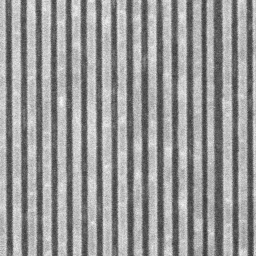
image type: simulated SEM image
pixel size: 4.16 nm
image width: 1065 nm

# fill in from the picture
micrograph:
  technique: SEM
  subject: parallel lines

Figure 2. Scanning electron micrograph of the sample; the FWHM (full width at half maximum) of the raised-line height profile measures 33.3 nanometres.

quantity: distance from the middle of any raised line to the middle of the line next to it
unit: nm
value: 62.7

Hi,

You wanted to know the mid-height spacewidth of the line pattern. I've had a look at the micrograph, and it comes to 29.1 nanometres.